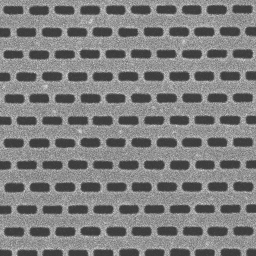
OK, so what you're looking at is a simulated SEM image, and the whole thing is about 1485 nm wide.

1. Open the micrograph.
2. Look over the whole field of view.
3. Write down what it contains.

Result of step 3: a regular array of holes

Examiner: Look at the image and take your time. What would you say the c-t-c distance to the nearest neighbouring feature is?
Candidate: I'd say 145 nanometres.